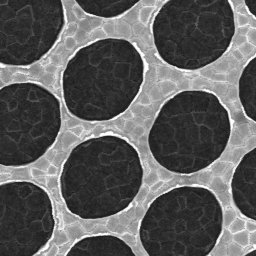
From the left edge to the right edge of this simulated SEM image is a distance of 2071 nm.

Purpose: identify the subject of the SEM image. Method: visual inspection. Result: holes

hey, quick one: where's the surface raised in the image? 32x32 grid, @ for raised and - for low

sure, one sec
--------@@-------@@@@--------@@-
--------@@@-----@@@@---------@@-
--------@@@@@@@@@@@----------@@@
--------@@@@@@@@@@@----------@@@
-------@@@@@@@@@@@@----------@@@
-------@@@@-----@@@----------@@@
------@@@@-------@@@--------@@@@
-----@@@@---------@@-------@@@@-
@@@@@@@@----------@@@@---@@@@@@-
@@@@@@@@----------@@@@@@@@@@@@--
@---@@@@----------@@@@@@@@@@@@--
------@@---------@@@@@@---@@@@--
-------@---------@@@@------@@@--
-------@--------@@@@--------@@--
--------@-----@@@@@@---------@@-
--------@@@@@@@@@@@----------@@@
-------@@@@@@@@@@@@----------@@@
-------@@@@----@@@@----------@@@
------@@@--------@@---------@@@@
-----@@@@--------@@--------@@@@-
---@@@@@----------@@------@@@@--
@@@@@@@@----------@@@@--@@@@@---
@@@@@@@@----------@@@@@@@@@@@---
-----@@@---------@@@@@---@@@@---
------@@---------@@@-------@@---
------@@--------@@@--------@@---
-------@@------@@@----------@@--
-------@@@@@@@@@@@----------@@@@
-------@@@@@@@@@@-----------@@@@
------@@@@@@--@@@----------@@@@@
------@@@-------@@---------@@@@@
-----@@@@--------@--------@@@@@-